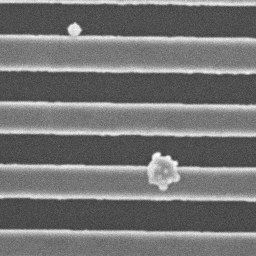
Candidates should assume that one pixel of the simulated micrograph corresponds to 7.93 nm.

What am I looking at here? lines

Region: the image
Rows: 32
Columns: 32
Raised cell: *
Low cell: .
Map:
.......................*********
................................
................................
.........*......................
***.....**......................
********************************
********************************
********************************
********************************
................................
................................
................................
................................
********************************
********************************
********************************
********************************
................................
................................
...................*............
...................***..........
********************************
********************************
********************************
********************************
................................
................................
................................
................................
********************************
********************************
********************************